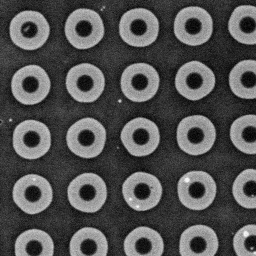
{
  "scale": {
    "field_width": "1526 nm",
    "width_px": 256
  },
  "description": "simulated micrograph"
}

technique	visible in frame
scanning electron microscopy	an array of small figures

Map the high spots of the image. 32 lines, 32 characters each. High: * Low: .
................................
...**....***....***...****...***
..****..*****..*****..****...***
.*****..*****..*****..*****..***
.*****..*****..*****..****...***
..***....***....***....**.......
................................
................................
...**....***....***....***...***
..****..*****..*****..*****..***
.*****..*****..*****..*****..***
..****...****..*****..****...***
..***.....**....**..............
................................
........................*......*
..***....****...***...*****..***
..****..*****..*****..*****..***
..****..*****..*****..*****..***
..****...****...****...***....**
...**.....**.....*..............
................................
........................*.....**
..****...****...****..*****..***
..****...****..*****..*****..***
..****...****..*****..*****..***
..****...****...****...***....**
...**......*....................
................................
..........**.....**.....**....**
..****...****...****...****..***
..*****..****...****..*****..***
..*****..****...****..*****..***